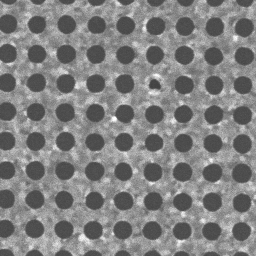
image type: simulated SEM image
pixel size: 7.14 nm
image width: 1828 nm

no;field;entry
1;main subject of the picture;a regular array of holes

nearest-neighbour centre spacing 207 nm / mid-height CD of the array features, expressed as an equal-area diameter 0.136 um